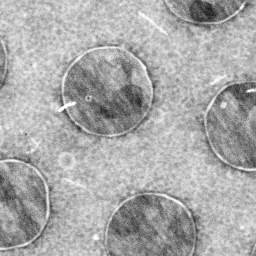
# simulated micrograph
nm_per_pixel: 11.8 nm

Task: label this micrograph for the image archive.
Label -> raised bodies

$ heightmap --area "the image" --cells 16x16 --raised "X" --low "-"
-----------XXXX-
----------------
----------------
-----XXX--------
----XXXXX-------
----XXXXX-----XX
----XXXXX----XXX
-----XXXX----XXX
-------------XXX
-------------XXX
XX-------------X
XXX-------------
XXX-----XXX-----
XXX----XXXXX----
XXX----XXXXX----
X------XXXXX----